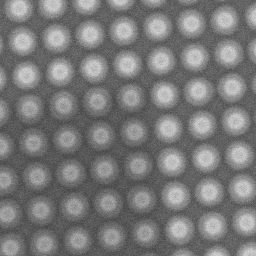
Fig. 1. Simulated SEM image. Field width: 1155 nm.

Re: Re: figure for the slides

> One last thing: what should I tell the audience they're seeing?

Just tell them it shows an array of small figures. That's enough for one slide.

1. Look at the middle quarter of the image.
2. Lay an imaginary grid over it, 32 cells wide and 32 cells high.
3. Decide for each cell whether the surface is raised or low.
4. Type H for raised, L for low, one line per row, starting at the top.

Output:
HHLLHHHHHHHLLHHHHHHLLHHHHHHHLLHH
HHLLHHHHHHHLLHHHHHHLLLHHHHHLLLLL
HHLLLHHHHHHLLHHHHHLLLLLHHLLLLLLL
HHLLLHHHHHLLLLLLLLLLLLLLLLLLLLLL
HLLLLLLHLLLLLLLLLLLLLLLLHLLLLLLH
LLLLLLLLLLLLLLLHHHLLLLLHHHHHLLHH
LLLLLLLHHHLLLLHHHHHLLLHHHHHHLLHH
HHLLLHHHHHHLLHHHHHHHLLHHHHHHLLHH
HHHLLHHHHHHHLHHHHHHHLLHHHHHHLLHH
HHHLLHHHHHHHLLHHHHHHLLHHHHHHLLLH
HHHLLHHHHHHHLLHHHHHHLLLHHHHLLLLL
HHHLLLHHHHHLLLLHHHHLLLLLLLLLLLLL
HHHLLLLHHHLLLLLLLLLLLLLLLLLLLLLL
HLLLLLLLLLLLLLLLLLLLLLLLHHHHLLLL
LLLLLLLLLLLLLLLHHHHHLLLHHHHHHLLH
LLLLLLLHHHHLLLLHHHHHHLLHHHHHHLLH
HHHLLLHHHHHHLLHHHHHHHLLHHHHHHLLH
HHHHLLHHHHHHHLHHHHHHHLLHHHHHHLLL
HHHHLLHHHHHHHLLHHHHHHLLLHHHHHLLL
HHHHLLHHHHHHLLLHHHHHLLLLLHHLLLLL
HHHHLLLHHHHLLLLLLLLLLLLLLLLLLLLL
HHHLLLLLLLLLLLLLLLLLLLLLLHHHLLLL
LLLLLLLLLLLLLLLLLHHHLLLLHHHHHHLL
LLLLLLLLHHHHLLLLHHHHHLLLHHHHHHLL
HHHHLLLHHHHHHLLHHHHHHHLHHHHHHHLL
HHHHHLLHHHHHHLLHHHHHHHLLHHHHHHLL
HHHHHLLHHHHHHHLHHHHHHHLLHHHHHHLL
HHHHHLLHHHHHHLLLHHHHHLLLLHHHHLLL
HHHHHLLHHHHHHLLLLHHHLLLLLLLLLLLL
HHHHLLLLLHHHLLLLLLLLLLLLLLLLLLLL
LHHLLLLLLLLLLLLLLLHHLLLLLHHHHHLL
LLLLLLLLLLHHLLLLLHHHHHLLLHHHHHHL